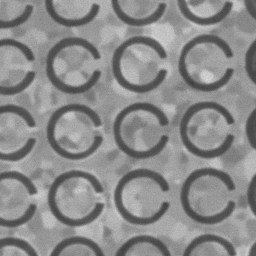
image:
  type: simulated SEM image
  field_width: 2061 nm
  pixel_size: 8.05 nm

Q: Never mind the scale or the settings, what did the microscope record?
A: an array of small figures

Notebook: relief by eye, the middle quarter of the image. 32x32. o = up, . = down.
oooooooooooo..oooooooooooooo...o
oooooooooooo...ooooooooo.oooo..o
ooooooo..ooo...oooooooo...ooo..o
oooooo...ooo...oooooooo..ooooo..
ooooo...ooooo....ooooo...ooooo..
.......ooooooo..........ooooooo.
......oooooooooo......oooooooooo
o...oooooooooooooooooooooooooooo
oooooooooooooooooooooooooooooooo
oooooooooooooooooo...ooooooooooo
......oooooooooo.......oooooooo.
........oooooo..........oooooo..
ooooo....oooo...oooooo...ooooo..
oooooo...oooo..oooooooo...ooo...
ooooooo...oo...ooooooooo..ooo..o
ooooooo..ooo..oooooooooo.oooo..o
oooooooooooo..ooooooooooooooo..o
oooooooooooo..ooooooooooooooo..o
ooooooo...ooo..ooooooooo..ooo..o
ooooooo...ooo..oooooooo...ooo...
oooooo...oooo...ooooooo..ooooo..
.oooo...oooooo....ooo....oooooo.
.......oooooooo.........oooooooo
......ooooooooooo.....oooooooooo
oooooooooooooooooooooooooooooooo
oooooooooooooooooooooooooooooooo
oo...oooooooooooo.....oooooooooo
.......oooooooo.........ooooooo.
.........ooooo...........oooooo.
oooooo...oooo...ooooooo...oooo..
ooooooo...ooo..ooooooooo..oooo..
ooooooo...oo...ooooooooo..ooo...